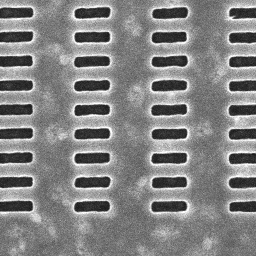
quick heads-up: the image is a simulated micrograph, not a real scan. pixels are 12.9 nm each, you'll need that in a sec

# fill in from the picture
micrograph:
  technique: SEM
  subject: a regular array of holes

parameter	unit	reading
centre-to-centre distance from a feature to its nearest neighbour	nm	310